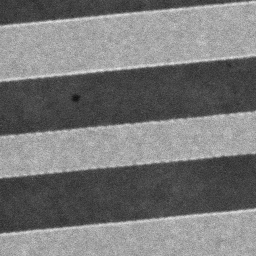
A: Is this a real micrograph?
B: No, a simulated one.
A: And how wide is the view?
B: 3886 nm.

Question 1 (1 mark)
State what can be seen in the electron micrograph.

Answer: lines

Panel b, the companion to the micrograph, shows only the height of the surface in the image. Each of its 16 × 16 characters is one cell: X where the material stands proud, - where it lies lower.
------------XXXX
-XXXXXXXXXXXXXXX
XXXXXXXXXXXXXXXX
XXXXXXXXXXXXXXXX
XXXXXX----------
----------------
----------------
-----------XXXXX
XXXXXXXXXXXXXXXX
XXXXXXXXXXXXXXXX
XXXXXX----------
----------------
----------------
------------XXXX
--XXXXXXXXXXXXXX
XXXXXXXXXXXXXXXX